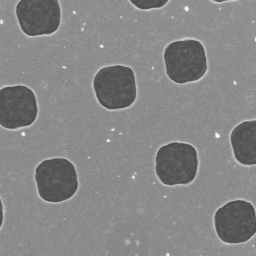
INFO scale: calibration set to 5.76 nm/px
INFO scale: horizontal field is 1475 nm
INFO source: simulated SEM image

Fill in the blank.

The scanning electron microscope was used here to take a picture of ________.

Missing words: holes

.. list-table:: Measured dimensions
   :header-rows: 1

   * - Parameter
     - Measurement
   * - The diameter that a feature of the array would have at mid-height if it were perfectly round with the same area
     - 254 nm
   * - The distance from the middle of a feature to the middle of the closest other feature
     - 498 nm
